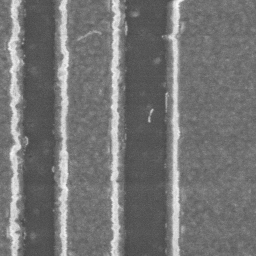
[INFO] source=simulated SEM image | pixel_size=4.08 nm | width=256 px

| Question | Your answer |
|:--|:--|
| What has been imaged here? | one or a few lines or trenches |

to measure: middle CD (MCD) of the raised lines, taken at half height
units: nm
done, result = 220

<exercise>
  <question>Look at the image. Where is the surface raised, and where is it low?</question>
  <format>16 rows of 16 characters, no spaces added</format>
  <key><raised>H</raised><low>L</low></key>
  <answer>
HLLLHHHLLLLHHHHH
HLLLHHHLLLLHHHHH
HLLLHHHLLLLHHHHH
HLLLHHHLLLLHHHHH
HLLLHHHLLLLHHHHH
HLLLHHHLLLLHHHHH
HLLLHHHLLLLHHHHH
HLLLHHHLLLLHHHHH
HLLLHHHLLLLHHHHH
HLLLHHHLLLLHHHHH
HLLLHHHLLLLHHHHH
HLLLHHHLLLLHHHHH
HLLLHHHLLLLHHHHH
HLLLHHHLLLLHHHHH
HLLLHHHLLLLHHHHH
HLLLHHHLLLLHHHHH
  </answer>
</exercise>